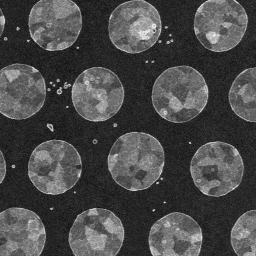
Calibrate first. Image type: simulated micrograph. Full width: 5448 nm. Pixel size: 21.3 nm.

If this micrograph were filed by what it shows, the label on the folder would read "raised bodies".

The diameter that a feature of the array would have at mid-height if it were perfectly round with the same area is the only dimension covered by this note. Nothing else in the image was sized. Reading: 1140 nanometers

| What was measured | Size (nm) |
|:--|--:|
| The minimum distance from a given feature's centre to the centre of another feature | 1700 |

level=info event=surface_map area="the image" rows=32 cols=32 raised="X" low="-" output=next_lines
-----XXXX------XXXX------XXXXX--
----XXXXXX----XXXXXX-----XXXXXX-
X---XXXXXX----XXXXXX----XXXXXXX-
----XXXXXX----XXXXXX----XXXXXXX-
----XXXX-X----XXXXXX-----XXXXX--
-----XXXX-----XXXXX------XXXXX--
--------------------------------
--------------------------------
-XXX--------X---------XX--------
XXXXX-----XXXX------XXXXX-----XX
XXXXXX---XXXXXX----XXXXXXX---XXX
XXXXXX---XXXXXX----XXXXXXX---XXX
XXXXXX---XXXXXX----XXXXXXX---XXX
XXXXX----XXXXXX----XXXXXX----XXX
-XXX------XXXX------XXXX------XX
--------------------------------
--------------------------------
---------------XXXXX------------
-----XXXX-----XXXXXX-----XXXX---
----XXXXXX----XXXXXX----XXXXXX--
X---XXXXXX----XXXXXX----XXXXXX--
X---XXXXXX----XXXXXX----XXXXXX--
----XXXXXX----XXXXX-----XXXXXX--
-----XXXX-------XX-------XXXX---
--------------------------------
--------------------------------
XXXX-------XXX-----------------X
XXXXX----XXXXXX-----XXXX------XX
XXXXXX---XXXXXX----XXXXXX----XXX
XXXXXX---XXXXXX----XXXXXX----XXX
XXXXX----XXXXXX----XXXXXX----XXX
XXXXX----XXXXXX----XXXXXX----XXX